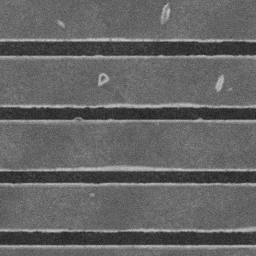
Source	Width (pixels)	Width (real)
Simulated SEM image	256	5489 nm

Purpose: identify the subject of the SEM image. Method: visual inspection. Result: lines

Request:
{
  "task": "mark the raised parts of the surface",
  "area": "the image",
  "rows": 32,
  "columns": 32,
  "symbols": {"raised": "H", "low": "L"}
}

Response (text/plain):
HHHHHHHHHHHHHHHHHHHHHHHHHHHHHHHH
HHHHHHHHHHHHHHHHHHHHHHHHHHHHHHHH
HHHHHHHHHHHHHHHHHHHHHHHHHHHHHHHH
HHHHHHHHHHHHHHHHHHHHHHHHHHHHHHHH
HHHHHHHHHHHHHHHHHHHHHHHHHHHHHHHH
LLLLLLLLLLLLLLLLLLLLLLLLLLLLLLLL
LLLLLLLLLLLLLLLLLLLLLLLLLLLLLLLL
HHHHHHHHHHHHHHHHHHHHHHHHHHHHHHHH
HHHHHHHHHHHHHHHHHHHHHHHHHHHHHHHH
HHHHHHHHHHHHHHHHHHHHHHHHHHHHHHHH
HHHHHHHHHHHHHHHHHHHHHHHHHHHHHHHH
HHHHHHHHHHHHHHHHHHHHHHHHHHHHHHHH
HHHHHHHHHHHHHHHHHHHHHHHHHHHHHHHH
LLLLLLLLLLLLLLLLLLLLLLLLLLLLLLLL
LLLLLLLLLLLLLLLLLLLLLLLLLLLLLLLL
HHHHHHHHHHHHHHHHHHHHHHHHHHHHHHHH
HHHHHHHHHHHHHHHHHHHHHHHHHHHHHHHH
HHHHHHHHHHHHHHHHHHHHHHHHHHHHHHHH
HHHHHHHHHHHHHHHHHHHHHHHHHHHHHHHH
HHHHHHHHHHHHHHHHHHHHHHHHHHHHHHHH
HHHHHHHHHHHHHHHHHHHHHHHHHHHHHHHH
LLLLLLLLLLLLLLLLLLLLLLLLLLLLLLLL
LLLLLLLLLLLLLLLLLLLLLLLLLLLLLLLL
HHHHHHHHHHHHHHHHHHHHHHHHHHHHHHHH
HHHHHHHHHHHHHHHHHHHHHHHHHHHHHHHH
HHHHHHHHHHHHHHHHHHHHHHHHHHHHHHHH
HHHHHHHHHHHHHHHHHHHHHHHHHHHHHHHH
HHHHHHHHHHHHHHHHHHHHHHHHHHHHHHHH
HHHHHHHHHHHHHHHHHHHHHHHHHHHHHHHH
LLLLLLLLLLLLLLLLLLLLLLLLLLLLLLLL
LLLLLLLLLLLLLLLLLLLLLLLLLLLLLLLL
HHHHHHHHHHHHHHHHHHHHHHHHHHHHHHHH